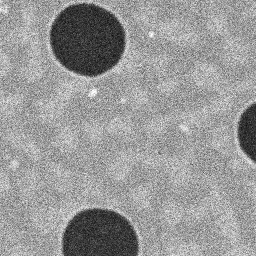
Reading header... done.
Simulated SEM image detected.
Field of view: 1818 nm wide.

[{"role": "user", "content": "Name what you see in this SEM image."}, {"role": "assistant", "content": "holes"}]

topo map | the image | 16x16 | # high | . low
####..##########
###.....########
###.....########
###.....########
#####..#########
################
################
###############.
###############.
###############.
################
################
################
#####...########
####....########
####.....#######